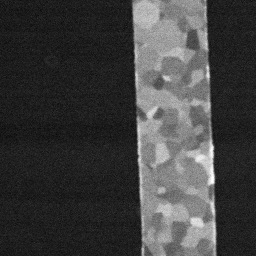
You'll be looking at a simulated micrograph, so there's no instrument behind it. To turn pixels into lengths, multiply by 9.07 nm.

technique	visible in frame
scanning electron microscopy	one or a few lines or trenches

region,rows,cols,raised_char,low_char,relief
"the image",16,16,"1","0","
0000000011111000
0000000011111000
0000000011111000
0000000011111000
0000000011111000
0000000001111000
0000000001111000
0000000001111000
0000000001111000
0000000001111000
0000000001111000
0000000001111000
0000000001111000
0000000001111000
0000000001111000
0000000001111000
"